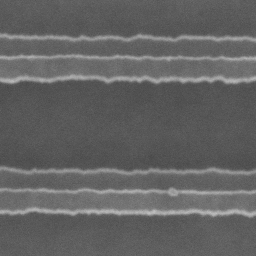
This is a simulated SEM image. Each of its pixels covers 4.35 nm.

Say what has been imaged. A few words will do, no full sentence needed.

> lines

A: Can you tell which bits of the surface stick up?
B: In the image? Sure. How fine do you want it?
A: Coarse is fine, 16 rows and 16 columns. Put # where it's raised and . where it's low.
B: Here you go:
................
................
################
################
################
................
................
................
................
................
................
################
################
................
................
................